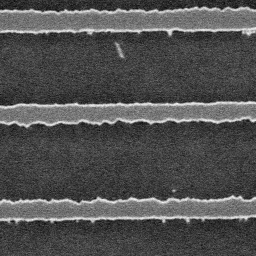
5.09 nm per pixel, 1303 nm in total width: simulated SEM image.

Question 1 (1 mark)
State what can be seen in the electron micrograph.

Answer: lines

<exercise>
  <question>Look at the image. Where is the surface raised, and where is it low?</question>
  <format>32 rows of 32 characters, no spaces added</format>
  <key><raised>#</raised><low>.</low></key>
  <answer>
................................
#####.##########################
################################
################################
................................
................................
................................
................................
................................
................................
................................
................................
................................
################################
################################
..##.##.........................
................................
................................
................................
................................
................................
................................
................................
................................
................................
################################
################################
#..#..##........................
................................
................................
................................
................................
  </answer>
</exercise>